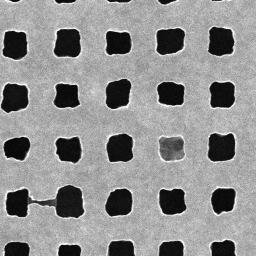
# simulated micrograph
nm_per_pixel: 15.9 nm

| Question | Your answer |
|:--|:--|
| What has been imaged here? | a regular array of holes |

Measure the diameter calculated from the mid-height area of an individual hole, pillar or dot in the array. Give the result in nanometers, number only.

442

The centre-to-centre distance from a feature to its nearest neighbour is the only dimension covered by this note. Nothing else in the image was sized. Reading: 50.9 px